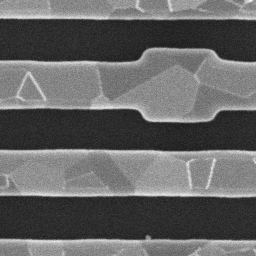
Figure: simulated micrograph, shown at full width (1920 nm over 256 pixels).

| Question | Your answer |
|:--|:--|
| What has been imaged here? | wiring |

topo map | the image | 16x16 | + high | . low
++++++++++++++++
................
................
.........+++++..
++++++++++++++++
++++++++++++++++
++++++++++++++++
.........++++...
................
++++++++++++++++
++++++++++++++++
++++++++++++++++
................
................
................
++++++++++++++++